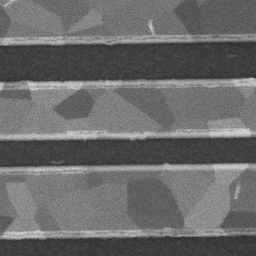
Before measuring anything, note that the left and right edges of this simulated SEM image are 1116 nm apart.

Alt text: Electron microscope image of one or a few lines or trenches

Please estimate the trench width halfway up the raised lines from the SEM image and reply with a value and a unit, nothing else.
159 nanometres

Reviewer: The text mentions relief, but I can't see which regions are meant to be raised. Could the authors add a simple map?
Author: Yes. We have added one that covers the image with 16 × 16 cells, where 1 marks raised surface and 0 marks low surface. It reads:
1111111111111111
1111111111111111
1111111111100000
0000000000000000
0000000000000000
1111111111111111
1111111111111111
1111111111111111
1000000000000000
0000000000000000
0000000000000011
1111111111111111
1111111111111111
1111111111111111
1111111111111111
0000000000000000